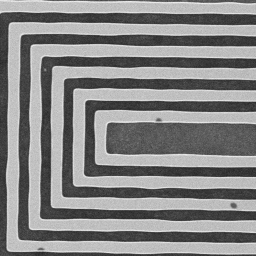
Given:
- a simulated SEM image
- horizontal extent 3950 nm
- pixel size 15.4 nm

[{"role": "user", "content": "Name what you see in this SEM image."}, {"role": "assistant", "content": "groups of lines, slits or small figures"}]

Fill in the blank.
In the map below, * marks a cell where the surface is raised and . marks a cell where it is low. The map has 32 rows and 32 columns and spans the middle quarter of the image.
................................
********************************
********************************
*................***************
................................
................................
...*********************.****...
..******************************
..******************************
...**...........................
...**...........................
..***...........................
..***...************************
..***...************************
..***...****...................*
..***...***.....................
..***...**......................
..***...**......................
..***...**......................
..***...**......................
..***...**......................
..***...**......................
..***...***.....................
..***...************************
..***...************************
..***....................*******
..***...........................
..***...........................
..******************************
..******************************
........************************
................................